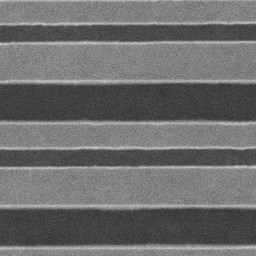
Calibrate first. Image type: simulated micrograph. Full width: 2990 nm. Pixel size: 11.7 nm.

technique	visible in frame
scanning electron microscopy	lines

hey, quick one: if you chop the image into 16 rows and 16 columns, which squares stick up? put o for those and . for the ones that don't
oooooooooooooooo
oooooooooooooooo
oooooooooooooooo
oooooooooooooooo
oooooooooooooooo
................
................
................
oooooooooooooooo
oooooooooooooooo
oooooooooooooooo
oooooooooooooooo
oooooooooooooooo
................
................
.........oo..ooo